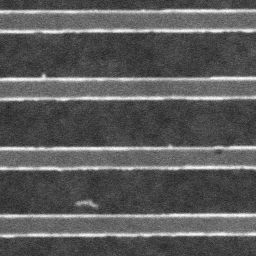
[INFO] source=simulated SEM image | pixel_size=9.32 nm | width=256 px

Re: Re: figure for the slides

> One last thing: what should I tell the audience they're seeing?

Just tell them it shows lines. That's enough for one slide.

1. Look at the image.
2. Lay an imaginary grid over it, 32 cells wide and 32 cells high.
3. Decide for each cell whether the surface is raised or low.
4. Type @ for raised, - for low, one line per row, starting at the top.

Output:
--------------------------------
@@@@@@@@@@@@@@@@@@@@@@@@@@@@@@@@
@@@@@@@@@@@@@@@@@@@@@@@@@@@@@@@@
@@@@@@@@@@@@@@@@@@@@@@@@@@@@@@@@
--------------------------------
--------------------------------
--------------------------------
--------------------------------
--------------------------------
--------------------------------
@@@@@@@@@@@@@@@@@@@@@@@@@@@@@@@@
@@@@@@@@@@@@@@@@@@@@@@@@@@@@@@@@
--------------------------------
--------------------------------
--------------------------------
--------------------------------
--------------------------------
--------------------------------
----------------------------@@@@
@@@@@@@@@@@@@@@@@@@@@@@@@@@@@@@@
@@@@@@@@@@@@@@@@@@@@@@@@@@@@@@@@
--------------------------------
--------------------------------
--------------------------------
--------------------------------
--------------------------------
--------------------------------
@@@@@@@@@@@@@@@@@@@@@@@@@@@@@@@@
@@@@@@@@@@@@@@@@@@@@@@@@@@@@@@@@
@@------------------------------
--------------------------------
--------------------------------